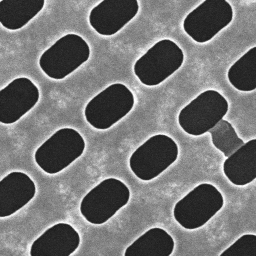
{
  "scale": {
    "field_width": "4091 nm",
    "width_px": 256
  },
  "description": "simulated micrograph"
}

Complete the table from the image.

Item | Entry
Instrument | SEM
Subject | holes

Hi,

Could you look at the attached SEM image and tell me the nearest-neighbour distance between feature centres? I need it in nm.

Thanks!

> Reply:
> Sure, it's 1060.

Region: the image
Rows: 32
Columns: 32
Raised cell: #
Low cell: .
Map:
.....#######.....########....###
.....######......#######.....###
....#######.....#######......###
#.##########...########.....####
########..##############...#####
#######....########...##########
######.....#######.....########.
#####......######......#######..
#####.....#######.....#######...
######..#########....########...
#...##########.###..#########...
.....########...#########..#####
.....######......#######....####
....#######.....#######.....####
...########.....######......####
###########...########.......###
#######...#############......###
######....########....####....#.
#####......######.....#####.....
####......######......######....
#####....#######.....#######....
######.##########...########....
....#########..##############...
....########....########...#####
....#######.....#######.....####
...#######......######......####
..########.....#######.....#####
###########...########....######
######...##############..#######
#####.....########...#########..
####......######......#######...
####.....#######.....#######....